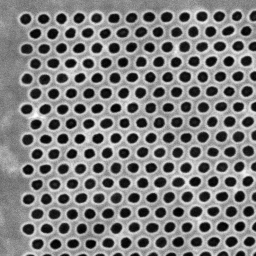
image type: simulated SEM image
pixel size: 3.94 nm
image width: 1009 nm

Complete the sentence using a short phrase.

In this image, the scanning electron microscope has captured a regular array of holes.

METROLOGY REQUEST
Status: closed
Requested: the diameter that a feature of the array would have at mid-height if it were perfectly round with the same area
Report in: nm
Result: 44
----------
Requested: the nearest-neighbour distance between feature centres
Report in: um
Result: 0.0666